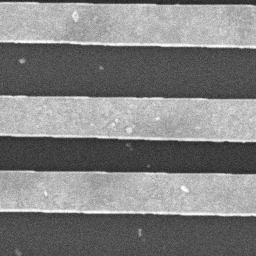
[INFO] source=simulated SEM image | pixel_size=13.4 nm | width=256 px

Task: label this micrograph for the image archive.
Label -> lines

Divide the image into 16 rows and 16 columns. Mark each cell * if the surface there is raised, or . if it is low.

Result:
****************
****************
****************
................
................
................
****************
****************
.***************
................
................
****************
****************
................
................
................